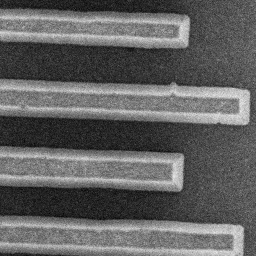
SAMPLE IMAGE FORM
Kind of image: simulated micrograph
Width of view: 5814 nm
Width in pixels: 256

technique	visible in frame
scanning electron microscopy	one or a few lines or trenches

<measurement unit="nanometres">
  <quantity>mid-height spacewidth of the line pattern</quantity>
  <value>919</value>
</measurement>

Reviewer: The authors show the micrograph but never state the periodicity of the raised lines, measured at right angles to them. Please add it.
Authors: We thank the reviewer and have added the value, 1580 nm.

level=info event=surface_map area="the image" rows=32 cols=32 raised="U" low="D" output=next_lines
DDDDDDDDDDDDDDDDDDDDDDDDDDDDDDDD
DDDDDDDDDDDDDDDDDDDDDDDDDDDDDDDD
UUUUUUUUUUUUUUUUUUUUUUUDDDDDDDDD
UUUUUUUUUUUUUUUUUUUUUUUDDDDDDDDD
UUUUUUUUUUUUUUUUUUUUUUUDDDDDDDDD
DDDDDDDDDDDDDDDDDDDDDDDDDDDDDDDD
DDDDDDDDDDDDDDDDDDDDDDDDDDDDDDDD
DDDDDDDDDDDDDDDDDDDDDDDDDDDDDDDD
DDDDDDDDDDDDDDDDDDDDDDDDDDDDDDDD
DDDDDDDDDDDDDDDDDDDDDDDDDDDDDDDD
DDDDDDDDDDDDDDDDDDDDDDDDDDDDDDDD
UUUUUUUUUUUUUUUUUUUUUUUUUDDDDDDD
UUUUUUUUUUUUUUUUUUUUUUUUUUUUUUDD
UUUUUUUUUUUUUUUUUUUUUUUUUUUUUUUD
DDDDDDDDDDDDDDDDDDDUUUUUUUUUUUUD
DDDDDDDDDDDDDDDDDDDDDDDDDDDDDDDD
DDDDDDDDDDDDDDDDDDDDDDDDDDDDDDDD
DDDDDDDDDDDDDDDDDDDDDDDDDDDDDDDD
DDDDDDDDDDDDDDDDDDDDDDDDDDDDDDDD
UUUUUUUUUUUUDUUDDDDDDDDDDDDDDDDD
UUUUUUUUUUUUUUUUUUUUUUDDDDDDDDDD
UUUUUUUUUUUUUUUUUUUUUUDDDDDDDDDD
UUUUUUUUUUUUUUUUUUUUUUDDDDDDDDDD
DDDDDDDDDDDDDDDDDDDDDDDDDDDDDDDD
DDDDDDDDDDDDDDDDDDDDDDDDDDDDDDDD
DDDDDDDDDDDDDDDDDDDDDDDDDDDDDDDD
DDDDDDDDDDDDDDDDDDDDDDDDDDDDDDDD
DDDDDDDDDDDDDDDDDDDDDDDDDDDDDDDD
UUUUUUUUUUUUUUUUUUUUUUUUDDDDDDDD
UUUUUUUUUUUUUUUUUUUUUUUUUUUUUUDD
UUUUUUUUUUUUUUUUUUUUUUUUUUUUUUDD
DDDDDDDDDDDDDUDUUUUUUUUUUUUUUUDD